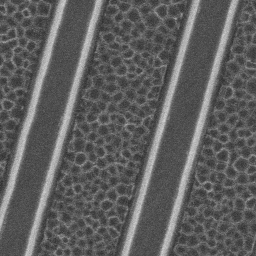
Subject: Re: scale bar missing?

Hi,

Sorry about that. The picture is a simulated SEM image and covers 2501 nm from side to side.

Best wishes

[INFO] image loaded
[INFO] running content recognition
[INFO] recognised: one or a few lines or trenches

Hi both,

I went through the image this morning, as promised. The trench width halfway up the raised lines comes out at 900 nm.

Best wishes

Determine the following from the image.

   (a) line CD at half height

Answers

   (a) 368 nanometers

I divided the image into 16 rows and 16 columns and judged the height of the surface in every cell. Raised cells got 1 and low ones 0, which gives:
0000110000001110
0001110000001100
0001110000001100
0001100000011100
0001100000011000
0011100000011000
0011000000111000
0011000000111000
0111000000110000
0111000000110000
0110000001110000
0110000001100000
1110000001100000
1100000011100000
1100000011100000
1100000011000000